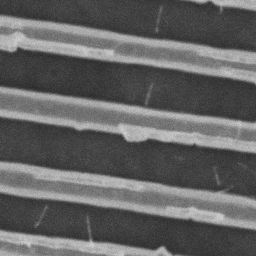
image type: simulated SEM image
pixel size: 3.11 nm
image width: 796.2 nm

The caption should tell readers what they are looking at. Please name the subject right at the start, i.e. one or a few lines or trenches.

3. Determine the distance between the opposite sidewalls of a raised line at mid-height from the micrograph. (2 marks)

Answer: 0.077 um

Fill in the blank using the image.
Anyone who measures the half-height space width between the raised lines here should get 47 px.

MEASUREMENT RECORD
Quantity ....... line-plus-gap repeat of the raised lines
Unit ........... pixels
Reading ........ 72.2